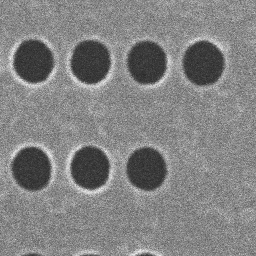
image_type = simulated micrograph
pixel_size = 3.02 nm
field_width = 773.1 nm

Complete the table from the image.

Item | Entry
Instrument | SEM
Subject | holes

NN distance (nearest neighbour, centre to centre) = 0.17 um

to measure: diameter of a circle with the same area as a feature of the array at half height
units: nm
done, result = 129